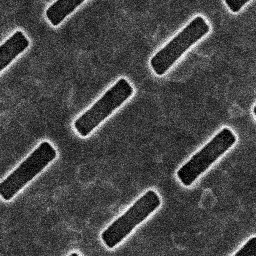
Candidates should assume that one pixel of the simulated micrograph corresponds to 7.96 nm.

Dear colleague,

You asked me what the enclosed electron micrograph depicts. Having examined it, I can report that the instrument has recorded holes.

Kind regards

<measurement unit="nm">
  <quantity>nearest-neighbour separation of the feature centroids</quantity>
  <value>779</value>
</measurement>